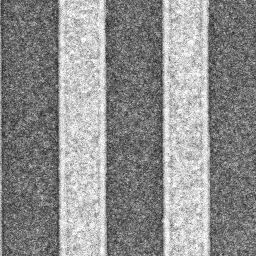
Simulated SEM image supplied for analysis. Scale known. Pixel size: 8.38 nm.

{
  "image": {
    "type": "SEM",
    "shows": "one or a few lines or trenches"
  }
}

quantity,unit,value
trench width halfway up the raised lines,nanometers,542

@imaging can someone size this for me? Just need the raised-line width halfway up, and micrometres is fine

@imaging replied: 0.33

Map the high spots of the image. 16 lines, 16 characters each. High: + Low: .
....++....+++...
....++....+++...
....++....+++...
....++....+++...
....++....+++...
....++....+++...
....++....+++...
....++....+++...
....++....+++...
....++....+++...
....++....+++...
....++....+++...
....++....+++...
....++....+++...
....++....+++...
....++....+++...